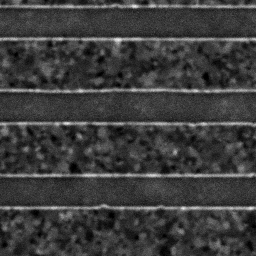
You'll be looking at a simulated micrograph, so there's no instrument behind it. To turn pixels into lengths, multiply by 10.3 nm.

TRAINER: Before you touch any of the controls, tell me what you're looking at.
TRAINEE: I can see one or a few lines or trenches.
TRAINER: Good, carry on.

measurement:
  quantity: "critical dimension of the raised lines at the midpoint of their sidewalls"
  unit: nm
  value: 536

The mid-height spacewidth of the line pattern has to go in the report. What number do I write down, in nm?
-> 334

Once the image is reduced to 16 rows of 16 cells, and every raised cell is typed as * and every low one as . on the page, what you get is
................
................
****************
****************
****************
****************
................
................
****************
****************
****************
................
................
****************
****************
****************